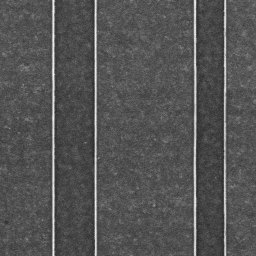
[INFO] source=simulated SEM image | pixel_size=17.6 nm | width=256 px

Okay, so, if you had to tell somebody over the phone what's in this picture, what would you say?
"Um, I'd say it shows one or a few lines or trenches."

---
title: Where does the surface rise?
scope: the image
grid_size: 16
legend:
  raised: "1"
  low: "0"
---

1110001111110011
1110001111110011
1110001111110011
1110001111110011
1110001111110011
1110001111110011
1110001111110011
1110001111110011
1110001111110011
1110001111110011
1110001111110011
1110001111110011
1110001111110011
1110001111110011
1110001111110011
1110001111110011